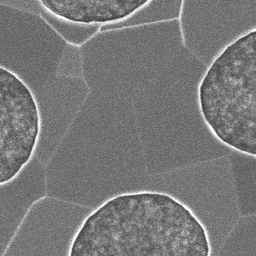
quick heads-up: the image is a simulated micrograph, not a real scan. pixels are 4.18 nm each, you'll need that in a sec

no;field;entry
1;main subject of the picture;holes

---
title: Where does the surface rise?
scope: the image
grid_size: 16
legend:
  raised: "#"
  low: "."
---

###......#######
################
###############.
##############..
.############...
..###########...
..###########...
..###########...
..############..
..#############.
.###############
################
#######....#####
######......####
#####........###
####.........###